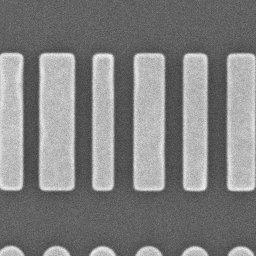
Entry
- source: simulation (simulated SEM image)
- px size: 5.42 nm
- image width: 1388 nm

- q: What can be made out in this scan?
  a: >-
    groups of lines, slits or small figures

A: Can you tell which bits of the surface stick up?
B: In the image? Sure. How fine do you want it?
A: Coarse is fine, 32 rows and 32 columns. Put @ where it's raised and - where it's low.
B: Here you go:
--------------------------------
--------------------------------
--------------------------------
--------------------------------
--------------------------------
--------------------------------
--------------------------------
@@@--@@@@---@@---@@@@--@@@--@@@@
@@@--@@@@---@@---@@@@--@@@--@@@@
@@@--@@@@---@@---@@@@--@@@--@@@@
@@---@@@@---@@---@@@@--@@@--@@@@
@@@--@@@@---@@---@@@@--@@@--@@@@
@@@--@@@@---@@---@@@@--@@@--@@@@
@@@--@@@@---@@---@@@@--@@@--@@@@
@@@--@@@@---@@---@@@@--@@@--@@@@
@@@--@@@@---@@---@@@---@@@--@@@@
@@@--@@@@---@@---@@@@--@@@--@@@@
@@@--@@@@---@@---@@@---@@@--@@@@
@@@--@@@@---@@---@@@---@@@--@@@@
@@@--@@@@---@@---@@@---@@@--@@@@
@@@--@@@@---@@---@@@---@@@---@@@
@@@--@@@@---@@---@@@@--@@@---@@@
@@@--@@@@---@@---@@@@--@@@---@@@
@@---@@@@---@@---@@@---@@----@@@
--------------------------------
--------------------------------
--------------------------------
--------------------------------
--------------------------------
--------------------------------
--------------------------------
@@@---@@----@@---@@@---@@@---@@-